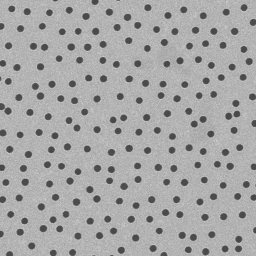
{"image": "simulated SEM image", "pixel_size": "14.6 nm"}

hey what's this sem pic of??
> a regular array of holes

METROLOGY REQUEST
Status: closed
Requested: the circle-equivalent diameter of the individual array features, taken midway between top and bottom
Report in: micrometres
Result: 0.103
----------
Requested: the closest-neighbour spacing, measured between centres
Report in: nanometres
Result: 220